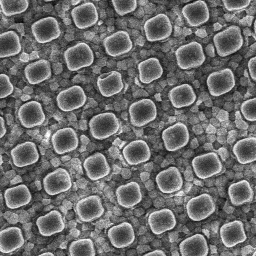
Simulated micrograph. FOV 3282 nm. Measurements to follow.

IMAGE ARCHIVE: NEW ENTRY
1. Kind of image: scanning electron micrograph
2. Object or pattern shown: a regular array of raised bodies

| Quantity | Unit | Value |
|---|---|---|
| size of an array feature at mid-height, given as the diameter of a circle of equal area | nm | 320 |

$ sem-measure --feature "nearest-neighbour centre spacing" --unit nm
527